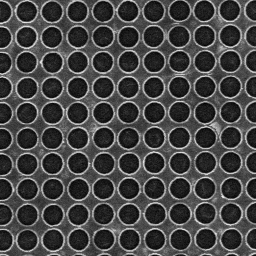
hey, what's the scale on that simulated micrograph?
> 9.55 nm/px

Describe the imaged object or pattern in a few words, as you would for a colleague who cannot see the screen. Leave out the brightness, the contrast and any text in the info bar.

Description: a regular array of holes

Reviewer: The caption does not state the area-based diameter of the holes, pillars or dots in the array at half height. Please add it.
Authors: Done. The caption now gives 197 nm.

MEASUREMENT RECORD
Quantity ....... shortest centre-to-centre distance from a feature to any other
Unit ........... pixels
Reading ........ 25.1